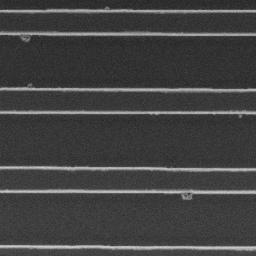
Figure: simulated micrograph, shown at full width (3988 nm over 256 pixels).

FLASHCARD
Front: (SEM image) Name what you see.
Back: lines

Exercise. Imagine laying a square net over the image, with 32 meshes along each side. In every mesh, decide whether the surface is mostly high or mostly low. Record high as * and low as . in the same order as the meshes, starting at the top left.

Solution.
................................
********************************
********************************
********************************
................................
................................
................................
................................
................................
................................
................................
********************************
********************************
********************************
................................
................................
................................
................................
................................
................................
................................
********************************
********************************
********************************
................................
................................
................................
................................
................................
................................
................................
********************************